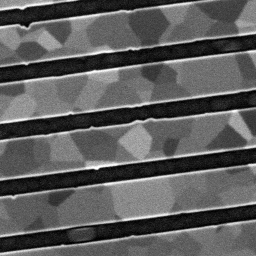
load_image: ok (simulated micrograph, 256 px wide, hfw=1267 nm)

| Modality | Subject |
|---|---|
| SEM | parallel lines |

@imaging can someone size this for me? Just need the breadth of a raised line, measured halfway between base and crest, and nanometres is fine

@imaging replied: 192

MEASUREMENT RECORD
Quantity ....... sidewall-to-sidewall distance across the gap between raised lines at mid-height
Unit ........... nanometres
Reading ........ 87.1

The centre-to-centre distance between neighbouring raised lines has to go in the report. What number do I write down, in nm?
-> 278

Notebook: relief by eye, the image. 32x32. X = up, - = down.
XXXXXX----------------XXXXXXXXXX
--------------XXXXXXXXXXXXXXXXXX
-------XXXXXXXXXXXXXXXXXXXXXXXXX
XXXXXXXXXXXXXXXXXXXXXXXXXXXXXXXX
XXXXXXXXXXXXXXXXXXXXXXXXXXXXX---
XXXXXXXXXXXXXXXXXXXXX-----------
XXXXXXXXXXXXX-----------------XX
XXXXXX-----------------XXXXXXXXX
---------------XXXXXXXXXXXXXXXXX
--------XXXXXXXXXXXXXXXXXXXXXXXX
-XXXXXXXXXXXXXXXXXXXXXXXXXXXXXXX
XXXXXXXXXXXXXXXXXXXXXXXXXXXXXX--
XXXXXXXXXXXXXXXXXXXXXX----------
XXXXXXXXXXXXXX------------------
XXXXXXX------------------XXXXXXX
----------------XXXXXXXXXXXXXXXX
--------XXXXXXXXXXXXXXXXXXXXXXXX
-XXXXXXXXXXXXXXXXXXXXXXXXXXXXXXX
XXXXXXXXXXXXXXXXXXXXXXXXXXXXXX--
XXXXXXXXXXXXXXXXXXXXXXX---------
XXXXXXXXXXXXXXX-----------------
XXXXXXX-----------------XXXXXXXX
-----------------XXXXXXXXXXXXXXX
---------XXXXXXXXXXXXXXXXXXXXXXX
--XXXXXXXXXXXXXXXXXXXXXXXXXXXXXX
XXXXXXXXXXXXXXXXXXXXXXXXXXXXXXX-
XXXXXXXXXXXXXXXXXXXXXXXX--------
XXXXXXXXXXXXXXXX----------------
XXXXXXXXXXX--------------XXXXXXX
---------XXX------XXXXXXXXXXXXXX
---------XXXXXXXXXXXXXXXXXXXXXXX
-XXXXXXXXXXXXXXXXXXXXXXXXXXXXXXX